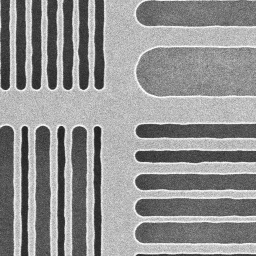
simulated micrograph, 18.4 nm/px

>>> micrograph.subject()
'groups of lines, slits or small figures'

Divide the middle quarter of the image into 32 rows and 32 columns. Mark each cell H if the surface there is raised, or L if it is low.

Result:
LLHHLLHHLLHHHHHHHHLLLLLLLLLLLLLL
LLHHLLHLLLHHHHHHHHLLLLLLLLLLLLLL
LLHHLLLLLLHHHHHHHHLLLLLLLLLLLLLL
LLHHLLHHLLHHHHHHHHLLLLLLLLLLLLLL
LLHHLLHHLLHHHHHHHHHLLLLLLLLLLLLL
LLHHLLHHLLHHHHHHHHHLLLLLLLLLLLLL
HHHHHHHHHHHHHHHHHHHHLLLLLLLLLLLL
HHHHHHHHHHHHHHHHHHHHHLLLLLLLLLLL
HHHHHHHHHHHHHHHHHHHHHHHHHHHHHHHH
HHHHHHHHHHHHHHHHHHHHHHHHHHHHHHHH
HHHHHHHHHHHHHHHHHHHHHHHHHHHHHHHH
HHHHHHHHHHHHHHHHHHHHHHHHHHHHHHHH
HHHHHHHHHHHHHHHHHHHHHHHHHHHHHHHH
HHHHHHHHHHHHHHHHHHHHHHHHHHHHHHHH
HHHHHHHHHHHHHHHHHHHHHHHHHHHHHHHH
HHHLHHHHLHHHHHHHHHLLLLLLLLLLLLLL
HHLLLLHLLHHHHHHHHHLLLLLLLLLLLLLL
HHLLLLHLLHHHHHHHHHLLLLLLLLLLLLLL
HHLLLLHLLHHHHHHHHHHLLLLLLLLLLLLL
HHLLLLHLLHHHHHHHHHHHHHHHHHHHHHHH
HHLLLLHLLHHHHHHHHHHHHHHHHHHHHHHH
HHLLLLHLLHHHHHHHHHHHHHHHHHHHHLLL
HHLLLLHLLHHHHHHHHHLLLLLLLLLLLLLL
HHLLLLHLLHHHHHHHHHLLLLLLLLLLLLLL
HHLLLLHLLHHHHHHHHHHLLLLLLLLLLLLL
HHLLLLHLLHHHHHHHHHHHHHHHHHHHHHHH
HHLLLLHLLHHHHHHHHHHHHHHHHHHHHHHH
HHLLLLHLLHHHHHHHHHHLLLLLLLLLLLLL
HHLLLLHLLHHHHHHHHHLLLLLLLLLLLLLL
HHLLLLHLLHHHHHHHHHLLLLLLLLLLLLLL
HHLLLLHLLHHHHHHHHHLLLLLLLLLLLLLL
HHLLLLHLLHHHHHHHHHHHLLLHHHLLLLLL